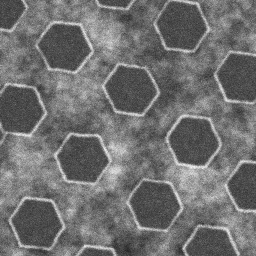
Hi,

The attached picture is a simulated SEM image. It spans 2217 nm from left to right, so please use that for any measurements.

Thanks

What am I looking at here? raised bodies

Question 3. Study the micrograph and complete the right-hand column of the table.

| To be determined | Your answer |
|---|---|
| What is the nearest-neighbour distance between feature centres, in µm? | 0.683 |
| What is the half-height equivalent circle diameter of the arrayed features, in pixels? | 51.5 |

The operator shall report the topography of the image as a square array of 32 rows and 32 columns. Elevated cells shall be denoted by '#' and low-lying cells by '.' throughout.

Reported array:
###.........####.....####.......
###.................#####.......
##.................#######......
##....####..........######......
.....######.........######......
.....######.........#####.......
.....######.....................
......#####.................####
......####....####.........#####
..............#####........#####
.............######........#####
#####........#######........####
#####.........#####.........####
#####.........#####.............
######.................#........
#####.................####......
####.................######.....
........#####........######.....
........#####........######.....
.......#######........#####.....
.......#######........####....##
........#####................###
........####......#.........####
.................#####......####
................######.......###
...####.........#######......###
..#####..........######.........
.#######.........#####..........
..######..........###....###....
..#####.................#####...
...####................######...
..........####.........#######..